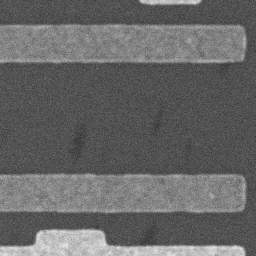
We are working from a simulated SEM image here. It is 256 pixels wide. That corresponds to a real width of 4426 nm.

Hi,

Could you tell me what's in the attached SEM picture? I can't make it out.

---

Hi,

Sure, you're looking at wiring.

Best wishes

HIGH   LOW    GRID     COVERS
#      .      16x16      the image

................
................
###############.
###############.
................
................
................
................
................
................
................
###############.
###############.
................
...###..........
.##############.